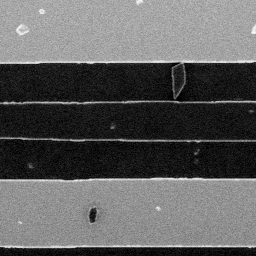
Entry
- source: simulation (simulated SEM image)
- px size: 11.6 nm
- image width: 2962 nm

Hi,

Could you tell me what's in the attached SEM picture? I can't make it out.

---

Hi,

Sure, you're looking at lines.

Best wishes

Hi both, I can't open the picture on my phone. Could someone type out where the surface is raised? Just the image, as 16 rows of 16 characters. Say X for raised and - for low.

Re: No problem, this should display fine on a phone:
XXXXXXXXXXXXXXXX
XXXXXXXXXXXXXXXX
XXXXXXXXXXXXXXXX
XXXXXXXXXXXXXXXX
-----------X----
----------------
XXXXXXXXXXXXXXXX
XXXXXXXXXXXXXXXX
XXXXXXXXXXXXXXXX
----------------
----------------
XXXXXXXXXXXXXXXX
XXXXXXXXXXXXXXXX
XXXXXXXXXXXXXXXX
XXXXXXXXXXXXXXXX
----------------